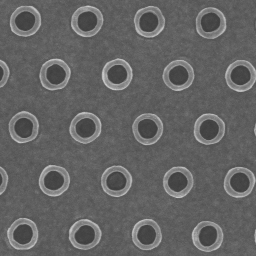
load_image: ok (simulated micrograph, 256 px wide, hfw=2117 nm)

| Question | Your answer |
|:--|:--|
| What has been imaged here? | a regular array of ring-shaped raised bodies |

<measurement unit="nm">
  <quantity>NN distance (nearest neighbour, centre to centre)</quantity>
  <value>503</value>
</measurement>